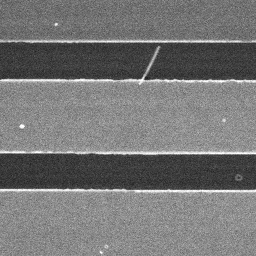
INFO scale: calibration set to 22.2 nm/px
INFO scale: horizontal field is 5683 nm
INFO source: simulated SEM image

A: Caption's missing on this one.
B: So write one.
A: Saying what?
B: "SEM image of lines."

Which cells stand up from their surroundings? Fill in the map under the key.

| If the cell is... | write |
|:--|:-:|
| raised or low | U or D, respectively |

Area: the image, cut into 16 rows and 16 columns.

UUUUUUUUUUUUUUUU
UUUUUUUUUUUUUUUU
UUUUUUUUUUUUUUUU
DDDDDDDDDDDDDDDD
DDDDDDDDDDDDDDDD
UUUUUUUUUUUUUUUU
UUUUUUUUUUUUUUUU
UUUUUUUUUUUUUUUU
UUUUUUUUUUUUUUUU
UUUUUUUUUUUUUUUU
DDDDDDDDDDDDDDDD
DDDDDDDDDDDDDDDD
UUUUUUUUUUUUUUUU
UUUUUUUUUUUUUUUU
UUUUUUUUUUUUUUUU
UUUUUUUUUUUUUUUU